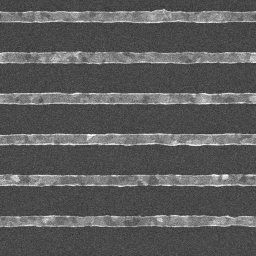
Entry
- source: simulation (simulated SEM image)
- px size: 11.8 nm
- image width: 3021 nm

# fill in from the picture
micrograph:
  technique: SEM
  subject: parallel lines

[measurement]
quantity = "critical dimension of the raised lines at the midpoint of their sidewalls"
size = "119 nm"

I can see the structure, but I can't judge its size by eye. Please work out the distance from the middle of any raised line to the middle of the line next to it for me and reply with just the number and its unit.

482 nm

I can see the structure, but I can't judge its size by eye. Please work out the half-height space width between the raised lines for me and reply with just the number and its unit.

366 nm